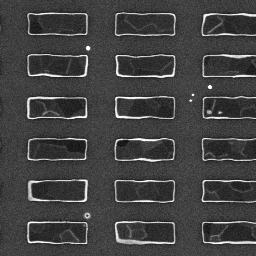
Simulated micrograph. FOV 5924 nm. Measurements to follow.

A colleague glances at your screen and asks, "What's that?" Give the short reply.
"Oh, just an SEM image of groups of lines, slits or small figures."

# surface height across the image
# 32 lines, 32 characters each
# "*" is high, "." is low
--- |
................................
................................
....*******....*******...*******
....*******....*******...*******
................................
................................
................................
....*******....*******...*******
....*******....*******...*******
.......**.......**.**.....****..
................................
................................
....*******....*******....******
....*******....*******...*******
....******.....*******....******
................................
................................
....******.....******....*******
....*******...********...*******
....*******...********...*******
................................
................................
................................
....*******...********...*******
....*******....*******...*******
................................
................................
................................
....*******....*******...*******
....*******....*******...*******
................................
................................